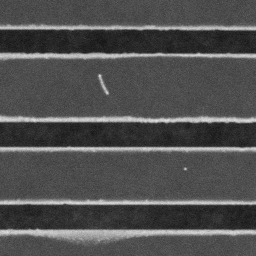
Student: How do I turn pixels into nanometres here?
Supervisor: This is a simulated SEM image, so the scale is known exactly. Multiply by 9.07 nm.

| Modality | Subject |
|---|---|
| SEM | lines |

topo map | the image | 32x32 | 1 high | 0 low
11111111111111111111111111111111
11111111111111111111111111111111
11111111111111111111111111111111
11111111111111111111111111111111
00000000000000000000000000000000
00000000000000000000000000000000
00000000000000000000000000000000
11111111111111111111111111111111
11111111111111111111111111111111
11111111111111111111111111111111
11111111111111111111111111111111
11111111111111111111111111111111
11111111111111111111111111111111
11111111111111111111111111111111
11111111111111111111111111111111
00000000000000000000000000000000
00000000000000000000000000000000
00000000000000000000000000000000
11111111111111111111111111111101
11111111111111111111111111111111
11111111111111111111111111111111
11111111111111111111111111111111
11111111111111111111111111111111
11111111111111111111111111111111
11111111111111111111111111111111
01000001010011111111111111111111
00000000000000000000000000000000
00000000000000000000000000000000
00000000000000000000000000000000
11111111111111111111111111111111
11111111111111111111111111111111
11111111111111111111111111111111